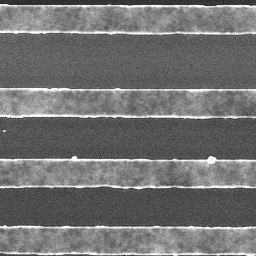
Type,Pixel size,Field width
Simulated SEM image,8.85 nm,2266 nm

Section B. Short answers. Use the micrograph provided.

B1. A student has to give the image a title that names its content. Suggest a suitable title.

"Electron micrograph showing lines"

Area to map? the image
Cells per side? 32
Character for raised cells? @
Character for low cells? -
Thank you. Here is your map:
--------------------------------
@@@@@@@@@@@@@@@@@@@@@@@@@@@@@@@@
@@@@@@@@@@@@@@@@@@@@@@@@@@@@@@@@
@@@@@@@@@@@@@@@@@@@@@@@@@@@@@@@@
--------------------------------
--------------------------------
--------------------------------
--------------------------------
--------------------------------
--------------------------------
--------------------------------
@@@@@@@@@@@@@@@@@@@@@@@@@@@@@@@@
@@@@@@@@@@@@@@@@@@@@@@@@@@@@@@@@
@@@@@@@@@@@@@@@@@@@@@@@@@@@@@@@@
@@@@@@@@@@@@@@@@@@@@@@@@@@@@@@@@
--------------------------------
--------------------------------
--------------------------------
--------------------------------
--------------------------------
@@@@@@@@@@@@@@@@@@@@@@@@@@@@@@@@
@@@@@@@@@@@@@@@@@@@@@@@@@@@@@@@@
@@@@@@@@@@@@@@@@@@@@@@@@@@@@@@@@
----------------@@--------------
--------------------------------
--------------------------------
--------------------------------
--------------------------------
@@@@@@@@@@@@@@@@@@@@@@@@@@@@@@@@
@@@@@@@@@@@@@@@@@@@@@@@@@@@@@@@@
@@@@@@@@@@@@@@@@@@@@@@@@@@@@@@@@
@@@@@@@@@@@@@@@@@@@@@@@@@@@@@@@@